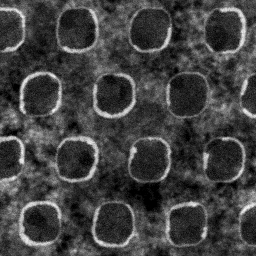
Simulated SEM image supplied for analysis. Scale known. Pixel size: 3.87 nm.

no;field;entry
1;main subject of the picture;a regular array of raised bodies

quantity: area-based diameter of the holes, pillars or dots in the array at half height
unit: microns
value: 0.174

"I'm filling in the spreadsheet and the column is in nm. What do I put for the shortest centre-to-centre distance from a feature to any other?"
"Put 284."